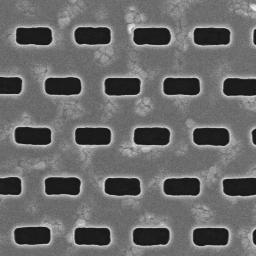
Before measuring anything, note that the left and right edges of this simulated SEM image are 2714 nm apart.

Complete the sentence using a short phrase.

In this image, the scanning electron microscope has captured a regular array of holes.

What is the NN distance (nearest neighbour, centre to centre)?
57.9 pixels